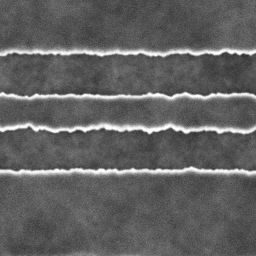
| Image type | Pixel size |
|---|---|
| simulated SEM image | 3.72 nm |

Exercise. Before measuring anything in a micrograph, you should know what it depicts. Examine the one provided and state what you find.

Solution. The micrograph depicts lines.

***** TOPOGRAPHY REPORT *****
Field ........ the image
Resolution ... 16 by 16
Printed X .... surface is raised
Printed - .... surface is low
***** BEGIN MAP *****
XXXXXXXXXXXXXXXX
XXXXXXXXXXXXXXXX
XXXXXXXXXXXXXXXX
----------------
----------------
----------------
XXXXXXXXXXXXXXXX
XXXXXXXXXXXXXXXX
----------------
----------------
----------------
XXXXXXXXXXXXXXXX
XXXXXXXXXXXXXXXX
XXXXXXXXXXXXXXXX
XXXXXXXXXXXXXXXX
XXXXXXXXXXXXXXXX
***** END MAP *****